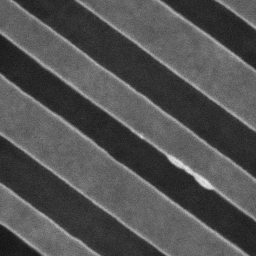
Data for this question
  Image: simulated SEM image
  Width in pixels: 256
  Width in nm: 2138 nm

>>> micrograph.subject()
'lines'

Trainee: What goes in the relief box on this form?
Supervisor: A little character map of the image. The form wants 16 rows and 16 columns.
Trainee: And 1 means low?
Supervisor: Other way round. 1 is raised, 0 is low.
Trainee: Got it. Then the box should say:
1000011111100011
1110000111110000
0111000011111000
0011100000111110
0001111000011111
1000011100001111
1110001111000011
1111000111100001
1111100001110000
0011111000111100
0001111100011110
0000111110000111
1000001111100011
1110000111110000
0111000011111000
0011110000111110